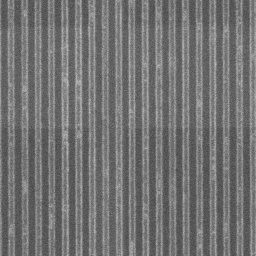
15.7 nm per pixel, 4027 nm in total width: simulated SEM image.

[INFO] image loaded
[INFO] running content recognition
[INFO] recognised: parallel lines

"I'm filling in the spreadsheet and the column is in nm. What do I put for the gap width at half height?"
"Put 124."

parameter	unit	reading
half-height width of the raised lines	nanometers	78.6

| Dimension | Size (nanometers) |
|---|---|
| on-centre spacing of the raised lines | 211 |